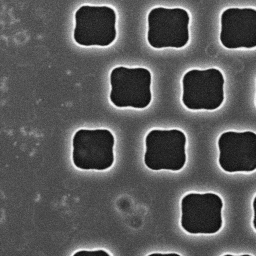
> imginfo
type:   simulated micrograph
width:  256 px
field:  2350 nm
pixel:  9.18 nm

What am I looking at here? holes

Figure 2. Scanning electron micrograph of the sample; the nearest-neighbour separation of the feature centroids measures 651 nm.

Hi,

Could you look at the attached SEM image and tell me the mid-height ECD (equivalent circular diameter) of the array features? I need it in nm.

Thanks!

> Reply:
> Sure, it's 414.